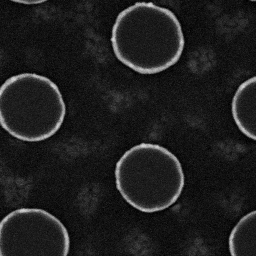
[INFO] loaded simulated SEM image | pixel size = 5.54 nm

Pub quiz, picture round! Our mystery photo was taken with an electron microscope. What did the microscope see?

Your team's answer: raised bodies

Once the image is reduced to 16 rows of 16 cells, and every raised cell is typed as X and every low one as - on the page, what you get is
--------XX------
-------XXXX-----
-------XXXX-----
-------XXXX-----
----------------
XXXX-----------X
XXXX-----------X
XXXX-----------X
-XX-------------
--------XXX-----
-------XXXX-----
-------XXXX-----
--------XXX-----
XXX------------X
XXXX-----------X
XXXX----------XX